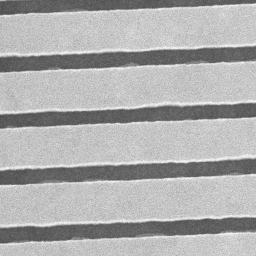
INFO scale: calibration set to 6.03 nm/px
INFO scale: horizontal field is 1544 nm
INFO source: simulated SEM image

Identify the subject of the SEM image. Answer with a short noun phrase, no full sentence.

lines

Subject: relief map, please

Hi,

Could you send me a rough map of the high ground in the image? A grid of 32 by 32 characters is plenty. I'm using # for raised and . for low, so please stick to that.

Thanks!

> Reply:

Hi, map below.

................................
..........######################
################################
################################
################################
################################
#############...................
................................
...............#################
################################
################################
################################
################################
#################...............
................................
.............###################
################################
################################
################################
################################
##################..............
................................
.................###############
################################
################################
################################
################################
#######################.........
................................
.....................###########
################################
################################